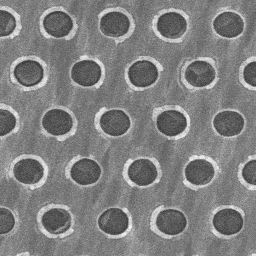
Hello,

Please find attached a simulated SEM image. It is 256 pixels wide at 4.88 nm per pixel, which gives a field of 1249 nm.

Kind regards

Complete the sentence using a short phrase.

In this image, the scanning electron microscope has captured a regular array of holes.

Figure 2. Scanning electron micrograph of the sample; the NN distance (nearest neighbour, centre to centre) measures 0.276 um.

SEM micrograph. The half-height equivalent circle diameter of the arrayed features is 143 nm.